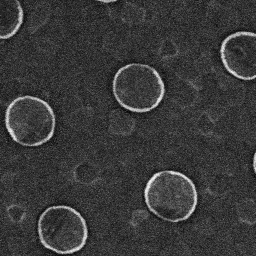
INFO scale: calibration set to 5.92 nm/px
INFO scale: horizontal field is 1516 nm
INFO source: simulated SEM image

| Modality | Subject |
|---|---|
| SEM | raised bodies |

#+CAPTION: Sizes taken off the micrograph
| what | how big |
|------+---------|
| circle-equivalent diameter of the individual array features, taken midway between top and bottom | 0.293 um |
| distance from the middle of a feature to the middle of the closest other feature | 113 pixels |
